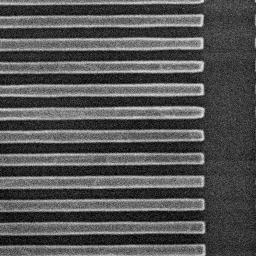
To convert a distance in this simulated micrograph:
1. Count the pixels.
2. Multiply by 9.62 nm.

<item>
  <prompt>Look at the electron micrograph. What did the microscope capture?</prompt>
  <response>wiring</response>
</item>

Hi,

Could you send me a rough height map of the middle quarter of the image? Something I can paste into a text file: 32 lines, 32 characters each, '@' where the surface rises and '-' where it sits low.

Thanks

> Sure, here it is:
@@@@@@@@@@@@@@@@@@@@@@@@@@@@@@@@
@@@@@@@@@@@@@@@@@@@@@@@@@@@@@@@@
--------------------------------
--------------------------------
--------------------------------
-----@@@@@@@@@@@@@@@@@@@@@@@@@@@
@@@@@@@@@@@@@@@@@@@@@@@@@@@@@@@@
@@@@@@@@@@@@@@@@@@@@@@@@@@@@@@@@
--------------------------------
--------------------------------
--------------------------------
@@@@@@@@@@@@@@@@@@@@@@@@@@@@@@@@
@@@@@@@@@@@@@@@@@@@@@@@@@@@@@@@@
@@@@----------------------------
--------------------------------
--------------------------------
--------------------------------
@@@@@@@@@@@@@@@@@@@@@@@@@@@@@@@@
@@@@@@@@@@@@@@@@@@@@@@@@@@@@@@@@
--------------------------------
--------------------------------
--------------------------------
--------------------------------
@@@@@@@@@@@@@@@@@@@@@@@@@@@@@@@@
@@@@@@@@@@@@@@@@@@@@@@@@@@@@@@@@
--------------------------------
--------------------------------
--------------------------------
@@@@@@@@@@@@@@@@@@@@@@@@@@@@@@@@
@@@@@@@@@@@@@@@@@@@@@@@@@@@@@@@@
@@@@@@@@@@@@@@@@@@@@@@@@@@@@@@@-
--------------------------------